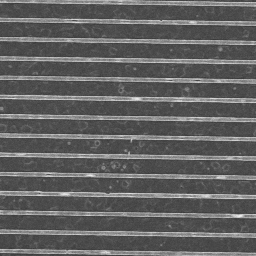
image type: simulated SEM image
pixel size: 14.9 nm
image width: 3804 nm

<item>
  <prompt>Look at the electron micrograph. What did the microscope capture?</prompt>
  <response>parallel lines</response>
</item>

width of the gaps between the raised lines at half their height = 225 nanometers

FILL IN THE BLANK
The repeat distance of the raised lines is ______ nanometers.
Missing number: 286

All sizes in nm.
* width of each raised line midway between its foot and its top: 57.6